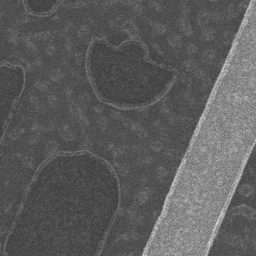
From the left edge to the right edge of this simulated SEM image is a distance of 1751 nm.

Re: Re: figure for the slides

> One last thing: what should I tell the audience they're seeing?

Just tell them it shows one or a few lines or trenches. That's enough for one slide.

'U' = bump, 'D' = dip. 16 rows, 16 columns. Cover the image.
DDUUDDDDDDDDDDDU
DDDDDDDDDDDDDDDU
DDDDDDDDDDDDDDDU
DDDDDUUUUDDDDDUU
UDDDDUUUUUUDDDUU
UDDDDDUUUUUDDUUU
UDDDDDDUUDDDDUUU
UDDDDDDDDDDDDUUU
DDDDDDDDDDDDUUUU
DDDDUDDDDDDDUUUU
DDUUUUUDDDDUUUUD
DDUUUUUDDDDUUUUD
DUUUUUUDDDUUUUDD
DUUUUUUDDDUUUUDD
DUUUUUUDDDUUUUDD
UUUUUUDDDUUUUDDD